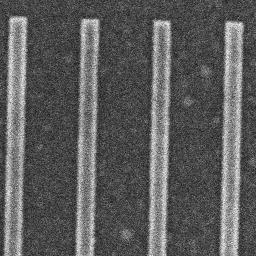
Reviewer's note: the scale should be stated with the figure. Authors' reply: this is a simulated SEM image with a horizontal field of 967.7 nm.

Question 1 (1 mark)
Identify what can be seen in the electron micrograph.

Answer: one or a few lines or trenches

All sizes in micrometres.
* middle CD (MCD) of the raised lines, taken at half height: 0.0562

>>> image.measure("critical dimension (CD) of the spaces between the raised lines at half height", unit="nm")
217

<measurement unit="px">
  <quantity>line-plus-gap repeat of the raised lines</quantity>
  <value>72.1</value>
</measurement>